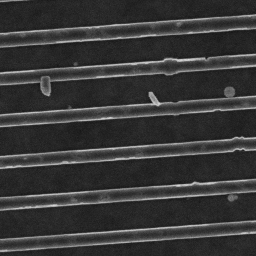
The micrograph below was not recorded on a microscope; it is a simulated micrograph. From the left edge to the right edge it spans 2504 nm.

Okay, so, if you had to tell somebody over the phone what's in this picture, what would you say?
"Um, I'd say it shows parallel lines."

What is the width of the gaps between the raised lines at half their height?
283 nm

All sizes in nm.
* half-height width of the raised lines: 123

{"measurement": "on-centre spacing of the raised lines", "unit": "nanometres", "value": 401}